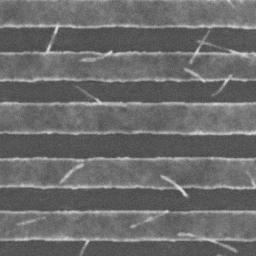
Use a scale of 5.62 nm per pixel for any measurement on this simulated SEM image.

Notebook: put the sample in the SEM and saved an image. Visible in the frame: lines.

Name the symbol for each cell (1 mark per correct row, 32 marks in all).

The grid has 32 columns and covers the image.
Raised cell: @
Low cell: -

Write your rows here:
@@@@@@@@@@@@@@@@@@@@@@@@@@@@@@@@
@@@@@@@@@@@@@@@@@@@@@@@@@@@@@@@@
@@@@@@@@@@@@@@@@@@@@@@@@@@@@@@@@
------------------------------@@
--------------------------------
--------------------------------
-----@@-----------------@----@--
@@@@@@@@@@@@@@@@@@@@@@@@@@@@@@@@
@@@@@@@@@@@@@@@@@@@@@@@@@@@@@@@@
@@@@@@@@@@@@@@@@@@@@@@@@@@@@@@@@
--------------------------------
--------------------------------
--------------------------------
@@@@@@@@@@@@@@@@@@@@@@@@@@@@@@@@
@@@@@@@@@@@@@@@@@@@@@@@@@@@@@@@@
@@@@@@@@@@@@@@@@@@@@@@@@@@@@@@@@
@@@@@@@@@@@@@@@@@@@@@@@@@@@@@@@@
--------------------------------
--------------------------------
--------------------------------
@@@@@@@@@@@@@@@@@@@@@@@@@@@@@@@@
@@@@@@@@@@@@@@@@@@@@@@@@@@@@@@@@
@@@@@@@@@@@@@@@@@@@@@@@@@@@@@@@@
---------@---------@@@@--@@--@@@
--------------------------------
--------------------------------
---@@---@@-@@@@@@@@@@--@@@@@@@@@
@@@@@@@@@@@@@@@@@@@@@@@@@@@@@@@@
@@@@@@@@@@@@@@@@@@@@@@@@@@@@@@@@
@@@@@@@@@@@@@@@@@@@@@@@@@@@@@@@@
--------------------------------
--------------------------------